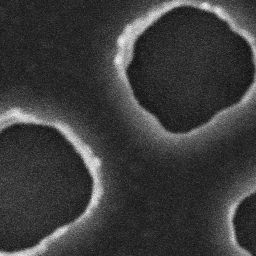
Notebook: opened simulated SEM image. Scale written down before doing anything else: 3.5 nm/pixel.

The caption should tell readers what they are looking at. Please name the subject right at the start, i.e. holes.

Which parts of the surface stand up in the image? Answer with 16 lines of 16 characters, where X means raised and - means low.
XXXXXXXXXXX-XXXX
XXXXXXXXX-----XX
XXXXXXXX-------X
XXXXXXXX--------
XXXXXXXX--------
XXXXXXXX--------
XXXXXXXXX------X
XXXXXXXXXX---XXX
----XXXXXXXXXXXX
-----XXXXXXXXXXX
-----XXXXXXXXXXX
------XXXXXXXXXX
------XXXXXXXXX-
-----XXXXXXXXXX-
---XXXXXXXXXXXX-
--XXXXXXXXXXXXX-